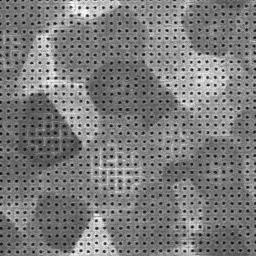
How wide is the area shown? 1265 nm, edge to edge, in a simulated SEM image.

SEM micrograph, a regular array of holes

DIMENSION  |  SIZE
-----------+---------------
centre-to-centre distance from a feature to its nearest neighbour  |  0.0356 microns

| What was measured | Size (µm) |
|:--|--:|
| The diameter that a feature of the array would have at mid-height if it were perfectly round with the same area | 0.0158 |